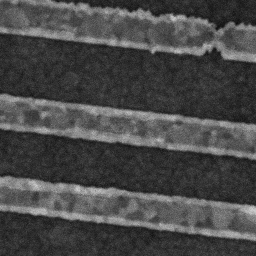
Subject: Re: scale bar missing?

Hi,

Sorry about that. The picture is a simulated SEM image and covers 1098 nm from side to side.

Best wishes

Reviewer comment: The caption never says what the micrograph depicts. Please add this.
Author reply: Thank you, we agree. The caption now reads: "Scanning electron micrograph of one or a few lines or trenches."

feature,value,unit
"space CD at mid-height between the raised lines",257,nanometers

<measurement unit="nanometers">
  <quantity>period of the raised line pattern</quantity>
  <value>378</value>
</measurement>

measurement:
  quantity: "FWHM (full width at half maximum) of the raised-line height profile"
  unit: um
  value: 0.123